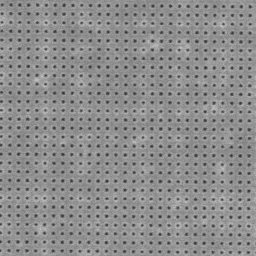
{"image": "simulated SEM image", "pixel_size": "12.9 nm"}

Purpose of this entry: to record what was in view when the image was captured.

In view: a regular array of holes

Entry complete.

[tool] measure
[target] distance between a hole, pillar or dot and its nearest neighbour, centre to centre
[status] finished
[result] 0.11 microns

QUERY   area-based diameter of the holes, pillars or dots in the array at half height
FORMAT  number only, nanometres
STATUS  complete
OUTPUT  45.9